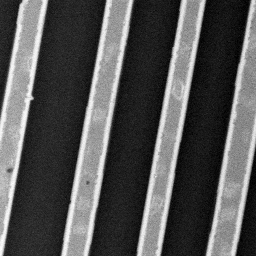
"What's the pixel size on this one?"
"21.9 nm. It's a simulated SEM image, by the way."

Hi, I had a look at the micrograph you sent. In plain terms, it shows one or a few lines or trenches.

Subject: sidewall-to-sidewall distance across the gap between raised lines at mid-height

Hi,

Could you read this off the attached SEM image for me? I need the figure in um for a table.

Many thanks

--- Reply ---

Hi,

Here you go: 1.18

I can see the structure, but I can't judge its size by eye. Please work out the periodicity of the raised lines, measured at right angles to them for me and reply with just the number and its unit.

1650 nm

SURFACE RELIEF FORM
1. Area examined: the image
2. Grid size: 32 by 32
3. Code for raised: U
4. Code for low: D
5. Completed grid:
DDDUUDDDDDDDDDUUDDDDDDDUUDDDDDDD
DDDUUDDDDDDDDUUUDDDDDDDUUDDDDDDU
DDUUUDDDDDDDDUUUDDDDDDDUUDDDDDDU
DDUUUDDDDDDDDUUUDDDDDDDUUDDDDDDU
DDUUUDDDDDDDDUUUDDDDDDUUUDDDDDDU
DDUUUDDDDDDDDUUDDDDDDDUUDDDDDDDU
DDUUDDDDDDDDDUUDDDDDDDUUDDDDDDDU
DDUUDDDDDDDDUUUDDDDDDDUUDDDDDDUU
DDUUDDDDDDDDUUUDDDDDDDUUDDDDDDUU
DUUUDDDDDDDDUUUDDDDDDUUUDDDDDDUU
DUUUDDDDDDDDUUDDDDDDDUUDDDDDDDUU
DUUUDDDDDDDDUUDDDDDDDUUDDDDDDDUU
DUUUDDDDDDDUUUDDDDDDDUUDDDDDDDUU
DUUDDDDDDDDUUUDDDDDDDUUDDDDDDUUU
UUUDDDDDDDDUUUDDDDDDUUUDDDDDDUUU
UUUDDDDDDDDUUDDDDDDDUUUDDDDDDUUU
UUUDDDDDDDDUUDDDDDDDUUDDDDDDDUUU
UUUDDDDDDDDUUDDDDDDDUUDDDDDDDUUU
UUDDDDDDDDUUUDDDDDDDUUDDDDDDUUUD
UUDDDDDDDDUUUDDDDDDDUUDDDDDDUUUD
UUDDDDDDDDUUUDDDDDDUUUDDDDDDUUUD
UUDDDDDDDDUUDDDDDDDUUDDDDDDDUUUD
UUDDDDDDDDUUDDDDDDDUUDDDDDDDUUUD
UUDDDDDDDDUUDDDDDDDUUDDDDDDDUUUD
UDDDDDDDDUUUDDDDDDDUUDDDDDDDUUDD
UDDDDDDDDUUUDDDDDDDUUDDDDDDUUUDD
UDDDDDDDDUUUDDDDDDUUUDDDDDDUUUDD
UDDDDDDDDUUDDDDDDDUUDDDDDDDUUUDD
UDDDDDDDDUUDDDDDDDUUDDDDDDDUUUDD
DDDDDDDDUUUDDDDDDDUUDDDDDDDUUDDD
DDDDDDDDUUUDDDDDDDUUDDDDDDUUUDDD
DDDDDDDDUUUDDDDDDDUUDDDDDDUUUDDD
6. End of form